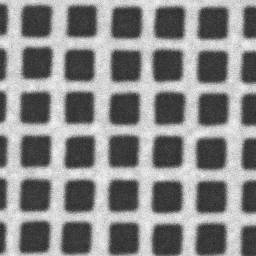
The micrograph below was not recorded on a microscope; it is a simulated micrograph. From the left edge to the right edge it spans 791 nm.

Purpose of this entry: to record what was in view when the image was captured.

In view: a regular array of holes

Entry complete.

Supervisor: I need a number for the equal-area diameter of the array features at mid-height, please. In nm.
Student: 108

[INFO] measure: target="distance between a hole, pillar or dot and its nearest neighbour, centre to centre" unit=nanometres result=131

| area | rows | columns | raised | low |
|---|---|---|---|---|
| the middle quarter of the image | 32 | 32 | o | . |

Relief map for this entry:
........oooo.......ooo........oo
........oooo.......ooo........oo
........oooo.......ooo........oo
........oooo.......ooo........oo
o.....ooooooo.oo..ooooo.....oooo
oooooooooooooooooooooooooooooooo
oooooooooooooooooooooooooooooooo
o......ooooo.......oooo.......oo
........oooo.......oooo.......oo
........ooo........oooo.......oo
........ooo........oooo.......oo
........ooo........oooo.......oo
........ooo........oooo.......oo
........ooo........oooo.......oo
.......oooo........oooo.......oo
ooooooooooooooo.oooooooooooooooo
oooooooooooooooooooooooooooooooo
oooooooooooooooooooooooooooooooo
o.......ooo........oooo.......oo
........ooo........ooo........oo
........ooo........ooo........oo
........ooo........ooo........oo
........ooo........ooo........oo
........ooo........ooo........oo
........ooo........ooo........oo
........ooo.......oooo.......ooo
oooooooooooooooooooooooooooooooo
oooooooooooooooooooooooooooooooo
oooooooooooooooooooooooooooooooo
o.......ooo.......ooooo......ooo
........ooo........ooo........oo
........ooo........ooo........oo